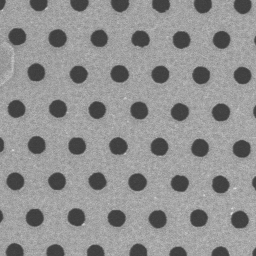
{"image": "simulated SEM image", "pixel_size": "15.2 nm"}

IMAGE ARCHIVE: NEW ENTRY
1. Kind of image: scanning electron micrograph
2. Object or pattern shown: a regular array of holes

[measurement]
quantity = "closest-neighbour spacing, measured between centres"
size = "612 nm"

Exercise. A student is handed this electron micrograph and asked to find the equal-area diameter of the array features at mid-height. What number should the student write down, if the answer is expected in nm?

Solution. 274